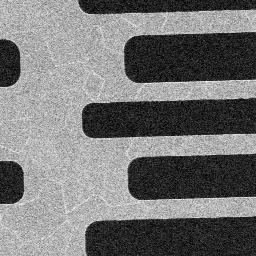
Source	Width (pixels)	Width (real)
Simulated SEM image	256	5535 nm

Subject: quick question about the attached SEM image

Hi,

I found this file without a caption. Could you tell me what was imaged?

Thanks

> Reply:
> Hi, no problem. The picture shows one or a few lines or trenches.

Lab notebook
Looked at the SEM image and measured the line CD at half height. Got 421 nanometers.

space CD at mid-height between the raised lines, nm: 948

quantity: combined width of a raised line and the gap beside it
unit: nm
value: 1330